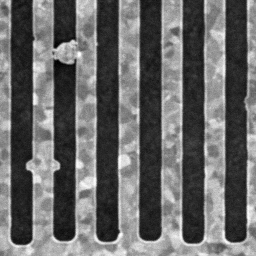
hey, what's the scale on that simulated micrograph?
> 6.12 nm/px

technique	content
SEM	parallel lines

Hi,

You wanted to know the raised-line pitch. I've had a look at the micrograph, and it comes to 0.262 µm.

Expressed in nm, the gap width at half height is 141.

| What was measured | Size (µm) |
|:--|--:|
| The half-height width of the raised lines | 0.117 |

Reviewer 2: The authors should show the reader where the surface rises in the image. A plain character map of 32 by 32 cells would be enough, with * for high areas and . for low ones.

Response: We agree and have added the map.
*...***...**...**...***...**...*
*...***...**...**...***...**...*
*...***...**...**...***...**...*
*...***...**...**...***...**...*
*...***...**...**...***...**...*
*...***.****...**...***...**...*
*...********...**...***...**...*
*...********...**...***...**...*
*...***...**...**...***...**...*
*...***...**...**...***...**...*
*...***...**...**...***...**...*
*...***...**...**...***...**...*
*...***...**...**...***...**...*
*...***...**...**...***...**...*
*...***...**...**...***...**...*
*...***...**...**...***...**...*
*...***...**...**...***...**...*
*...***...**...**...***...**...*
*...***...**...**...***...**...*
*...***...**...**...***...**...*
*..****...**...**...***...**...*
*...***...**...**...***...**...*
*...***...**...**...***...**...*
*...***...**...**...***...**...*
*...***...**...**...***...**...*
*...***...**...**...***...**...*
*...***...**...**...***...**...*
*...***...**...**...***...**...*
*...***...**...**...***...**...*
*...***..***...**...***...**...*
**..*******************..*******
********************************